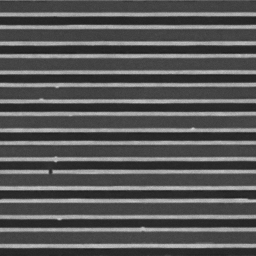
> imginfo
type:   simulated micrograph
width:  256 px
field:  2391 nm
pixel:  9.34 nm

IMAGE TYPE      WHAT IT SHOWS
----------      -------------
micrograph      parallel lines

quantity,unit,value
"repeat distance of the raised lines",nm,135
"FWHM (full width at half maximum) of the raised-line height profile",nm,40.9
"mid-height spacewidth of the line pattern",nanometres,84.1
